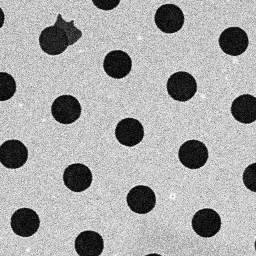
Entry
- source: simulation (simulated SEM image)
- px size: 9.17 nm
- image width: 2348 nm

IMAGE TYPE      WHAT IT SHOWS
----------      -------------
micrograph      a regular array of holes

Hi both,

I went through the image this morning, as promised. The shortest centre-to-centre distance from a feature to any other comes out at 619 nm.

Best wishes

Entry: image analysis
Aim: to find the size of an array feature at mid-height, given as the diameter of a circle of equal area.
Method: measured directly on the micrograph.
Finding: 272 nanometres